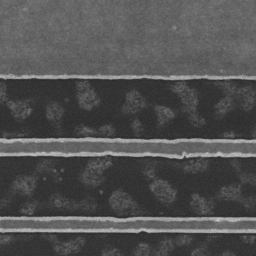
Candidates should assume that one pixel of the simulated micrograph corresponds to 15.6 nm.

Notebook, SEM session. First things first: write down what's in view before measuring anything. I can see one or a few lines or trenches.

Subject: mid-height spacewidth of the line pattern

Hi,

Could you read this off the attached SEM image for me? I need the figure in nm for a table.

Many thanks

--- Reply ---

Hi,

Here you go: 988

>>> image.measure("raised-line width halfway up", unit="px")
13.5